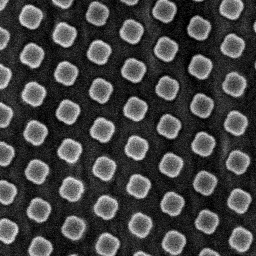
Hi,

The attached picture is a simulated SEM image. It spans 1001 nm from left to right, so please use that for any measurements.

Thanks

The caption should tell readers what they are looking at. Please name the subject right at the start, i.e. a regular array of raised bodies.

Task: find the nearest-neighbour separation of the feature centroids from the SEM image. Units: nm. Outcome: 150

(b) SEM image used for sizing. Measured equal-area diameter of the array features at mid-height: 22.5 px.